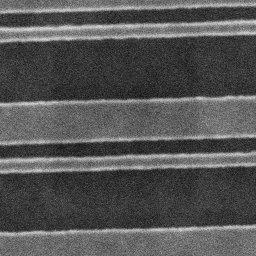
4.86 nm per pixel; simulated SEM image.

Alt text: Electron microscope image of lines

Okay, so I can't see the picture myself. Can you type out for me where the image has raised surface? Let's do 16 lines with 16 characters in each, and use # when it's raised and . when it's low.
################
################
###.............
................
................
................
################
################
################
################
##########......
................
................
................
..##############
################